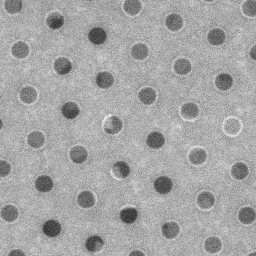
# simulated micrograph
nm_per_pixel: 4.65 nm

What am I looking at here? a regular array of raised bodies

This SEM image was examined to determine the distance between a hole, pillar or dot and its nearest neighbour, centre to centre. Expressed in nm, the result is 208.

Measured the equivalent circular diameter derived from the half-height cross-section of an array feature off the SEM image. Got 94.3 nanometers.